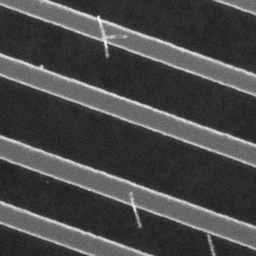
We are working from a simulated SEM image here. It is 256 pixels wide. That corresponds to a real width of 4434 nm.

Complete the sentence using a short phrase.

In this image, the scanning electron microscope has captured lines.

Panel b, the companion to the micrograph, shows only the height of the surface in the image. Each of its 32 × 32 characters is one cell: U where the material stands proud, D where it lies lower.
UUUUUUUDDDDDDDDDDDDDDDDDDDDDUUUU
DDUUUUUUUUDDDDDDDDDDDDDDDDDDDDDU
DDDDDUUUUUUUUDDDDDDDDDDDDDDDDDDD
DDDDDDDDUUUUUUUDDDDDDDDDDDDDDDDD
DDDDDDDDDDDUUUUUUUDDDDDDDDDDDDDD
DDDDDDDDDDDDDUUUUUUUUDDDDDDDDDDD
DDDDDDDDDDDDDDDDDUUUUUUUDDDDDDDD
UUDDDDDDDDDDDDDDDDDUUUUUUUUDDDDD
UUUUUDDDDDDDDDDDDDDDDDUUUUUUUDDD
UUUUUUUUDDDDDDDDDDDDDDDDDUUUUUUU
DDDUUUUUUUUDDDDDDDDDDDDDDDDDUUUU
DDDDDDUUUUUUUDDDDDDDDDDDDDDDDDUU
DDDDDDDDUUUUUUUUDDDDDDDDDDDDDDDD
DDDDDDDDDDDUUUUUUUUDDDDDDDDDDDDD
DDDDDDDDDDDDDDUUUUUUUUDDDDDDDDDD
DDDDDDDDDDDDDDDDDUUUUUUUDDDDDDDD
DDDDDDDDDDDDDDDDDDDDUUUUUUUDDDDD
UUDDDDDDDDDDDDDDDDDDDDDUUUUUUUDD
UUUUDDDDDDDDDDDDDDDDDDDDDUUUUUUU
UUUUUUUDDDDDDDDDDDDDDDDDDDDDUUUU
DDUUUUUUUUDDDDDDDDDDDDDDDDDDDDDU
DDDDDUUUUUUUUDDDDDDDDDDDDDDDDDDD
DDDDDDDUUUUUUUUUDDDDDDDDDDDDDDDD
DDDDDDDDDDUUUUUUUUDDDDDDDDDDDDDD
DDDDDDDDDDDDDUUUUUUUUDDDDDDDDDDD
UDDDDDDDDDDDDDDDUUUUUUUUDDDDDDDD
UUUUDDDDDDDDDDDDDDDUUUUUUUUDDDDD
UUUUUUDDDDDDDDDDDDDDDDUUUUUUUUDD
DDUUUUUUUDDDDDDDDDDDDDDDUUUUUUUU
DDDDUUUUUUUUDDDDDDDDDDDDDDDUUUUU
DDDDDDDUUUUUUUUDDDDDDDDDDDDDDDUU
DDDDDDDDDDUUUUUUUDDDDDDDDDDDDDDD